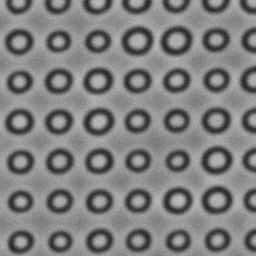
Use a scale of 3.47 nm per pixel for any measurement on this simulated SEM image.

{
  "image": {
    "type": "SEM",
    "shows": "a regular array of ring-shaped grooves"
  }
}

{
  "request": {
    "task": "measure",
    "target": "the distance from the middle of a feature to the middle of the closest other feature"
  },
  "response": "0.136 micrometres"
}